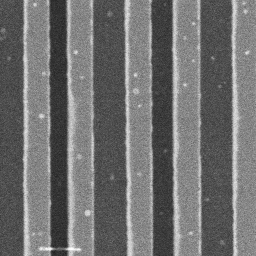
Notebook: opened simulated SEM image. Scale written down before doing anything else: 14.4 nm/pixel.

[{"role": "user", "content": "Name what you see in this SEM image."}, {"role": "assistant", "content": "lines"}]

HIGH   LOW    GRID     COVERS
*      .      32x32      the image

...***..****....***...***....***
...***..****....***...***....***
...***..****....***...***....***
...***..****....***...***....***
...***..****....***...***....***
...***..****....***...***....***
...***..****....***...***....***
...***..****....***...***....***
...***..****....***...***....***
...***..****....***...***....***
...***..****....***...***....***
...***..****....***...***....***
...***..****....***...***....***
...***..****....***...***....***
...***..****....***...***....***
...***..****....***...***....***
...***..****....***...***....***
...***..****....***...***....***
...***..****....***...***....***
...***..****....***...***....***
...***..****....***...***....***
...***..****....***...***....***
...***..****....***...***....***
...***..****....***...***....***
...***...***....***...***....***
...***...***....***...***....***
...***...***....***...***....***
...***...***....***...***....***
...***..****....***...***....***
...***..****....***...***....***
...***..****....***...***....***
...***..****....***...***....***